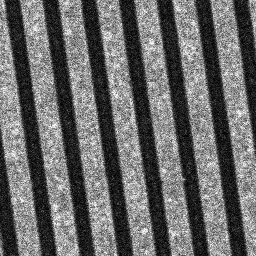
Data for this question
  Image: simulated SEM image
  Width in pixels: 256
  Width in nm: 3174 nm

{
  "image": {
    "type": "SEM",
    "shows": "parallel lines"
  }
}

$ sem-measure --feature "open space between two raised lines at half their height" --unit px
15.3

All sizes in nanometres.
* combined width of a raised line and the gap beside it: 467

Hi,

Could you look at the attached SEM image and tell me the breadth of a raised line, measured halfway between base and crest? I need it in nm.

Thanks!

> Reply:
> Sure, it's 276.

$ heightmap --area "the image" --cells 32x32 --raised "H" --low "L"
HLLHHLLHHHLLHHHLLHHHLLHHLLHHHLLH
HLLHHHLHHHLLHHHLLHHHLLHHHLLHHLLH
HLLHHHLLHHLLHHHLLHHHLLHHHLLHHLLH
HLLHHHLLHHHLLHHLLHHHLLHHHLLHHHLL
HLLHHHLLHHHLLHHLLHHHLLHHHLLHHHLL
HLLHHHLLHHHLLHHHLLHHLLHHHLLHHHLL
HLLHHHLLHHHLLHHHLLHHHLHHHLLHHHLL
HHLLHHHLHHHLLHHHLLHHHLLHHLLHHHLL
HHLLHHHLHHHLLHHHLLHHHLLHHHLLHHLL
HHLLHHHLLHHLLHHHLLHHHLLHHHLLHHLL
HHLLHHHLLHHHLLHHLLHHHLLHHHLLHHHL
HHLLHHHLLHHHLLHHHLHHHLLHHHLLHHHL
HHLLHHHLLHHHLLHHHLLHHLLHHHLLHHHL
HHHLHHHLLHHHLLHHHLLHHHLLHHLLHHHL
HHHLLHHLLHHHLLHHHLLHHHLLHHHLHHHL
HHHLLHHHLLHHLLHHHLLHHHLLHHHLLHHL
HHHLLHHHLLHHLLHHHLLHHHLLHHHLLHHH
HHHLLHHHLLHHHLLHHLLHHHLLHHHLLHHH
HHHLLHHHLLHHHLLHHHLHHHLLHHHLLHHH
LHHLLHHHLLHHHLLHHHLLHHLLHHHLLHHH
LHHHLHHHLLHHHLLHHHLLHHHLLHHLLHHH
LHHHLLHHLLHHHLLHHHLLHHHLLHHLLHHH
LHHHLLHHHLLHHLLHHHLLHHHLLHHHLLHH
LHHHLLHHHLLHHLLHHHLLHHHLLHHHLLHH
LHHHLLHHHLLHHHLLHHLLHHHLLHHHLLHH
LHHHLLHHHLLHHHLLHHHLHHHLLHHHLLHH
LLHHLLHHHLLHHHLLHHHLLHHLLHHHLLHH
LLHHHLLHHLLHHHLLHHHLLHHHLHHHLLHH
LLHHHLLHHLLHHHLLHHHLLHHHLLHHLLHH
LLHHHLLHHHLLHHLLHHHLLHHHLLHHHLLH
LLHHHLLHHHLLHHHLHHHLLHHHLLHHHLLH
LLHHHLLHHHLLHHHLLHHLLHHHLLHHHLLH